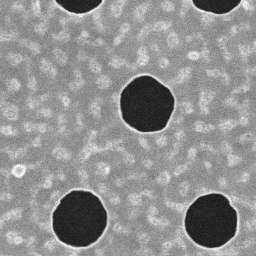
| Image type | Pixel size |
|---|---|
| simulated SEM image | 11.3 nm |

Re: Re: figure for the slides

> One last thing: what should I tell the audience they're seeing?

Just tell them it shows holes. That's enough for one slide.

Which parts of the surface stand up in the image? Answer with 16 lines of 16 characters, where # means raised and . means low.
####..######...#
################
################
################
################
########..######
########...#####
########...#####
################
################
################
################
####..######..##
###....#####...#
###...######...#
################